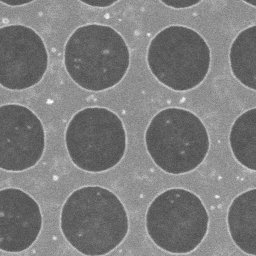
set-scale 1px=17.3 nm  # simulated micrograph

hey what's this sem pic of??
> holes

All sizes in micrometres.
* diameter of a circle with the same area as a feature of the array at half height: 1.09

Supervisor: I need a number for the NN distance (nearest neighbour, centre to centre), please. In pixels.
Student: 81.2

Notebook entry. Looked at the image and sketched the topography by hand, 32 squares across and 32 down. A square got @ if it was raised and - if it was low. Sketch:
@--@@@@@@@@---@@@@@@@----@@@@@@-
@@@@@@@@@@@@@@@@@@@@@@@@@@@@@@@@
@@@@@@@@@@@@@@@@@@@@@@@@@@@@@@@@
----@@@@@@----@@@@@@@--@@@@@@@@-
-----@@@@------@@@@@-----@@@@@--
-----@@@--------@@@-------@@@---
------@@--------@@@-------@@@---
------@@--------@@--------@@@---
------@@--------@@@-------@@@---
-----@@@@------@@@@-------@@@---
----@@@@@@----@@@@@@-----@@@@@--
@@@@@@@@@@@@@@@@@@@@@@@@@@@@@@@@
@@@@@@@@@@@@@@@@@@@@@@@@@@@@@@@@
---@@@@@@@@--@@@@@@@@@@@@@@@@@@@
-----@@@@------@@@@-----@@@@@@--
-----@@@@------@@@@------@@@@---
-----@@@--------@@--------@@@---
------@@--------@@--------@@@---
-----@@@--------@@--------@@@---
-----@@@@------@@@@-------@@@---
----@@@@@------@@@@@-----@@@@@--
@@@@@@@@@@@-@@@@@@@@@--@@@@@@@@@
@@@@@@@@@@@@@@@@@@@@@@@@@@@@@@@@
@@@@@@@@@@---@@@@@@@@@@@@@@@@@@@
----@@@@@------@@@@@-----@@@@@--
-----@@@-------@@@@------@@@@---
-----@@@--------@@--------@@@---
-----@@@--------@@--------@@----
-----@@@--------@@--------@@@---
-----@@@--------@@@-------@@@---
----@@@@@------@@@@@-----@@@@---
@-@@@@@@@@----@@@@@@@--@@@@@@@@-